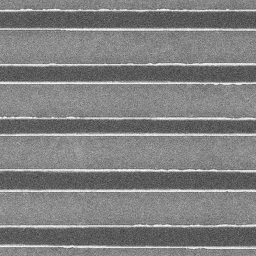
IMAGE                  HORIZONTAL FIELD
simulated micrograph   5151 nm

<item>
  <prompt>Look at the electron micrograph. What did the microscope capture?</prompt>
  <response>lines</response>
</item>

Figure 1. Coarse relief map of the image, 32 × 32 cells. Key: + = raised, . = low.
................................
++++++++++++++++++++++++++++++++
++++++++++++++++++++++++++++++++
++++++++++++++++++++++++++++++++
................................
................................
................................
................................
++++++++++++++++++++++++++++++++
++++++++++++++++++++++++++++++++
................................
................................
................................
................................
................................
++++++++++++++++++++++++++++++++
++++++++++++++++++++++++++++++++
................................
................................
................................
................................
++++++++++++++++++++++++++++++++
++++++++++++++++++++++++++++++++
++++++++++++++++++++++++++++++++
................................
................................
................................
................................
++++++++++++++++++++++++++++++++
++++++++++++++++++++++++++++++++
++++++++++++++++++++++++++++++++
................................